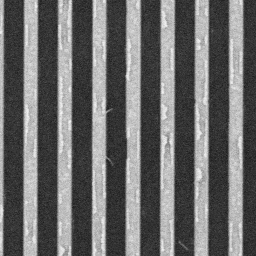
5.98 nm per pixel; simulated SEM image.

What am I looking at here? parallel lines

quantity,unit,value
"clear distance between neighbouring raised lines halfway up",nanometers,127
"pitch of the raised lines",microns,0.205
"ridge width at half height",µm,0.0763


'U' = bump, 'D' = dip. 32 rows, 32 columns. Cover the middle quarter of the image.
UUDDDDDUUUDDDDDDUUUDDDDDUUUDDDDD
UUDDDDDUUUDDDDDDUUUDDDDDUUUDDDDD
UUDDDDDUUUDDDDDDUUUDDDDDUUUDDDDD
UUDDDDDUUUDDDDDDUUUDDDDDUUUDDDDD
UUDDDDDUUUDDDDDDUUUDDDDDUUUDDDDD
UUDDDDDUUUDDDDDDUUUDDDDDUUUDDDDD
UUDDDDDUUUDDDDDDUUUDDDDDUUUDDDDD
UUDDDDDUUUDDDDDDUUUDDDDDUUUDDDDD
UUDDDDDUUUDDDDDDUUUDDDDDUUUDDDDD
UUDDDDDUUUDDDDDDUUUDDDDDUUUDDDDD
UUDDDDDUUUDDDDDDUUUDDDDDUUUDDDDD
UUDDDDDUUUDDDDDDUUUDDDDDUUUDDDDD
UUDDDDDUUUDDDDDDUUUDDDDDUUUDDDDD
UUDDDDDUUUDDDDDDUUUDDDDDUUUDDDDD
UUDDDDDUUUDDDDDDUUUDDDDDUUUDDDDD
UUDDDDDUUUDDDDDDUUUDDDDDUUUDDDDD
UUDDDDDUUUDDDDDDUUUDDDDDUUUDDDDD
UUDDDDDUUUDDDDDDUUUDDDDDUUUDDDDD
UUDDDDDUUUDDDDDDUUUDDDDDUUUDDDDD
UUDDDDDUUUDDDDDDUUUDDDDDUUUDDDDD
UUDDDDDUUUDDDDDDUUUDDDDDUUUDDDDD
UUDDDDDUUUDDDDDDUUUDDDDDUUUDDDDD
UUDDDDDUUUDDDDDDUUUDDDDDUUUDDDDD
UUDDDDDUUUUDDDDDUUUDDDDDUUUDDDDD
UUDDDDDUUUDDDDDDUUUDDDDDUUUDDDDD
UUDDDDDUUUDDDDDDUUUDDDDDUUUDDDDD
UUDDDDDUUUDDDDDDUUUDDDDDUUUDDDDD
UUDDDDDUUUDDDDDDUUUDDDDDUUUDDDDD
UUDDDDDUUUDDDDDDUUUDDDDDUUUDDDDD
UUDDDDDUUUDDDDDDUUUDDDDDUUUDDDDD
UUDDDDDUUUDDDDDDUUUDDDDDUUUDDDDD
UUDDDDDUUUDDDDDDUUUDDDDDUUUDDDDD